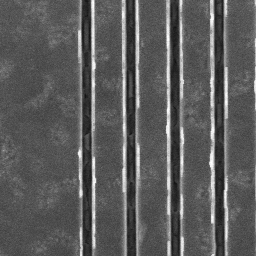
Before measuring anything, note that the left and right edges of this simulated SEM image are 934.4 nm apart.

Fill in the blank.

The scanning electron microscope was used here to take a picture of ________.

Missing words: parallel lines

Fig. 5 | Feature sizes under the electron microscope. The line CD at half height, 124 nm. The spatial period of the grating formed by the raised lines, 0.161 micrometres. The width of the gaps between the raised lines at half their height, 9.89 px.